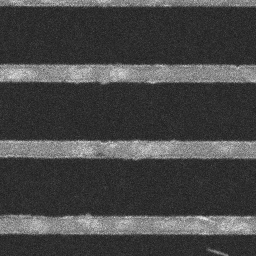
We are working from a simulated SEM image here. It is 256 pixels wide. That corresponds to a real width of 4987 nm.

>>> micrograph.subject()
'one or a few lines or trenches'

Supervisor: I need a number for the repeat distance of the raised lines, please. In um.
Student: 1.48